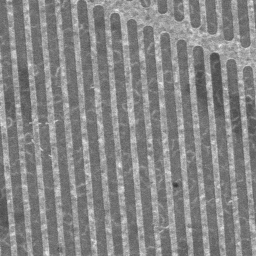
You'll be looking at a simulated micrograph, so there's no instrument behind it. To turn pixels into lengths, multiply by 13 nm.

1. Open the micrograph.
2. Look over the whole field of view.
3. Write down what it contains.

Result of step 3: parallel lines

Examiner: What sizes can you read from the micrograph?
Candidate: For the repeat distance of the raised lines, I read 208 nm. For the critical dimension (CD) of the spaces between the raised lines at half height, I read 139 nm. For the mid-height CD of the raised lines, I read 66.3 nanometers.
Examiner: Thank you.